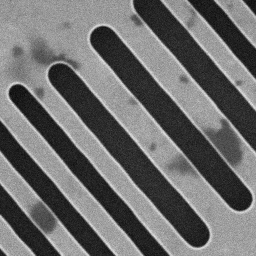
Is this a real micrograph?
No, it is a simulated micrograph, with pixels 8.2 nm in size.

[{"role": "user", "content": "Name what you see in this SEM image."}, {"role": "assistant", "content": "groups of lines, slits or small figures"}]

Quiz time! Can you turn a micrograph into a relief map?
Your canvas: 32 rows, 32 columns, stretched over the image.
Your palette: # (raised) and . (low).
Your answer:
#################...####...####.
#################....####...####
##################....####...###
############..#####....###....##
###########....####.....###....#
###########.....####.....###....
############.....####.....###...
#############....#####....####..
######...#####....#####....####.
######....#####....#####....####
######.....####.....#####....###
#...###....#####.....#####....##
#....###....#####.....####.....#
##....###....#####....#####.....
###...####....#####....#####....
####...###.....#####....#####...
.####...###.....#####....#####..
..####...###.....#####....#####.
...###....###.....####.....####.
#...###....###....#####.....####
#....###...####....#####....####
##....###...####....#####....###
###...####...###.....#####....##
.###...####...###.....#####....#
.####...####...###.....####.....
..####...####...###.....####...#
...####...###....###....########
#...###....###...####....#######
#....###...####...####....######
##....###...####...####...######
###...####...####...####..######
####...####...####...###########